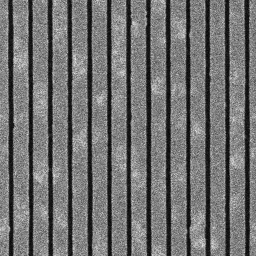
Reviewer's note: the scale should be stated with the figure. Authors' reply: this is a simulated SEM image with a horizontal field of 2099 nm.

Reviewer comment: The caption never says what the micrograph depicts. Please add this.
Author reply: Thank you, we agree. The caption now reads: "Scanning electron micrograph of parallel lines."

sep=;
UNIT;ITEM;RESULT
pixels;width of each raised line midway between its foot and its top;15.1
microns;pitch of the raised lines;0.161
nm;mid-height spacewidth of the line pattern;39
